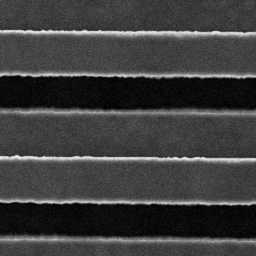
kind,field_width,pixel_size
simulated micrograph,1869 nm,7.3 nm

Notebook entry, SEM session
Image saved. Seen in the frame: lines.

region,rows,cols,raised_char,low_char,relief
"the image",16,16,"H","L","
HHHHHHHHHHHHHHHH
HHHHHHHHHHHHHHHH
HHHHHHHHHHHHHHHH
HHHHHHHHHHHHHHHH
HHHHHHHHHHHHHHHH
LLLLLLLLLLLLLLLL
LLLLLLLLLLLLLLLL
HHHHHHHHHHHHHHHH
HHHHHHHHHHHHHHHH
HHHHHHHHHHHHHHHH
HHHHHHHHHHHHHHHH
HHHHHHHHHHHHHHHH
HHHHHHHHHHHHHHHH
LLLLLLLLLLLLLLLL
LLLLLLLLLLLLLLLL
HHHHHHHHHHHHHHHH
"